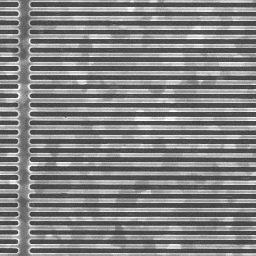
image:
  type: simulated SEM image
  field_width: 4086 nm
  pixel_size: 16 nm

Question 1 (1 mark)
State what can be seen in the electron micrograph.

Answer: parallel lines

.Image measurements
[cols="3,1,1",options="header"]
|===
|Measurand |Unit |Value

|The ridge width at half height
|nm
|58.9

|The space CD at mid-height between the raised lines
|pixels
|5.5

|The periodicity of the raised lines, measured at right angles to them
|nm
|145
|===